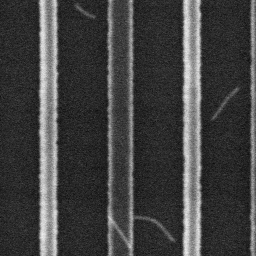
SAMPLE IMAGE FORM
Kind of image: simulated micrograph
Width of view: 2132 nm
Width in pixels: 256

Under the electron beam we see lines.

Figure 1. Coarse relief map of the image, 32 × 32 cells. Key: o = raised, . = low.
.....oo.......ooo......oo......o
.....oo.......ooo......oo......o
.....oo.......ooo......oo......o
.....oo.......ooo......oo......o
.....oo.......ooo......oo......o
.....oo.......ooo......oo......o
.....oo.......ooo......oo......o
.....oo.......ooo......oo.......
.....oo.......ooo......oo......o
.....oo.......ooo......oo......o
.....oo.......ooo......oo......o
.....oo.......ooo......oo......o
.....oo.......ooo......oo......o
.....oo.......ooo......oo.......
.....oo.......ooo......oo......o
.....oo.......ooo......oo......o
.....oo.......ooo......oo......o
.....oo.......ooo......oo......o
.....oo.......ooo......oo......o
.....oo.......ooo......oo......o
.....oo.......ooo......oo......o
.....oo.......ooo......oo......o
.....oo.......ooo......oo......o
.....oo.......ooo......oo......o
.....oo.......ooo......oo......o
.....oo.......ooo......oo......o
.....oo.......ooo......oo......o
.....oo.......ooo......oo......o
.....oo.......ooo......oo......o
.....oo.......ooo......oo......o
.....oo.......ooo......oo......o
.....oo.......ooo......oo......o